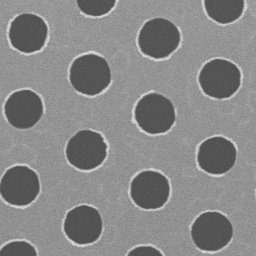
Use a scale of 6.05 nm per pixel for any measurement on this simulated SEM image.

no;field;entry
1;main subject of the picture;a regular array of holes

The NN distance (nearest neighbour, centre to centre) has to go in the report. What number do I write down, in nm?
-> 451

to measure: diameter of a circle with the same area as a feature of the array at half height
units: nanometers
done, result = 239